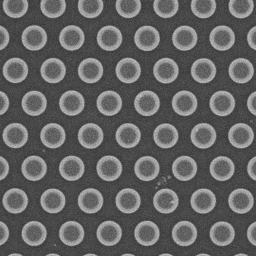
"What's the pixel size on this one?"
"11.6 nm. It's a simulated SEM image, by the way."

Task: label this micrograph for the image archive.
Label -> an array of small figures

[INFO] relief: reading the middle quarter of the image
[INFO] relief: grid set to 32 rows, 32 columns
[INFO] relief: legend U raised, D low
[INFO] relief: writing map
DDDDUUUUUUDDDUUUUUUDDDDUUUUUDDDD
DDDDUUUUUUDDDUUUUUUDDDUUUUUUUDDD
DDDDUUUUUUDDDUUUUUUDDDUUUUUUDDDD
DDDDUUUUUDDDDDUUUUDDDDDUUUUUDDDD
DDDDDUUUDDDDDDDUUDDDDDDDUUUDDDDD
DDDDDDDDDDDDDDDDDDDDDDDDDDDDDDDD
DDDDDDDDDDDDDDDDDDDDDDDDDDDDDDDD
UUUUDDDDDUUUUDDDDDDUUUUDDDDDUUUU
UUUUUDDDDUUUUUDDDDUUUUUUDDDUUUUU
UUUUUDDDUUUUUUDDDDUUUUUUDDDUUUUU
UUUUUDDDUUUUUUDDDDUUUUUUDDDUUUUU
UUUUDDDDDUUUUUDDDDUUUUUDDDDDUUUU
DUUDDDDDDDUUUDDDDDDUUUDDDDDDDUUU
DDDDDDDDDDDDDDDDDDDDDDDDDDDDDDDD
DDDDDDDDDDDDDDDDDDDDDDDDDDDDDDDD
DDDDDUUUUDDDDDUUUUDDDDDDUUUDDDDD
DDDDUUUUUDDDDUUUUUUDDDDUUUUUDDDD
DDDDUUUUUUDDDUUUUUUDDDUUUUUUDDDD
DDDDUUUUUUDDDUUUUUUDDDUUUUUUDDDD
DDDDUUUUUDDDDUUUUUUDDDDUUUUUDDDD
DDDDDUUUDDDDDDUUUUDDDDDDUUUDDDDD
DDDDDDDDDDDDDDDDDDDDDDDDDDDDDDDD
DDDDDDDDDDDDDDDDDDDDDDDDDDDDDDDD
UUUUDDDDDDUUUDDDDDDUUUDDDDDDDUUU
UUUUUDDDDUUUUUDDDDUUUUUDDDDDUUUU
UUUUUDDDUUUUUUDDDDUUUUUUDDDUUUUU
UUUUUDDDUUUUUUDDDDUUUUUUDDDUUUUU
UUUUUDDDDUUUUUDDDDUUUUUDDDDUUUUU
UUUUDDDDDUUUUDDDDDDUUUUDDDDDUUUU
DDDDDDDDDDDDDDDDDDDDDDDDDDDDDDDD
DDDDDDDDDDDDDDDDDDDDDDDDDDDDDDDD
DDDDDUUUDDDDDDDUUDDDDDDDUUUDDDDD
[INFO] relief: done